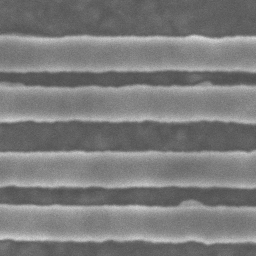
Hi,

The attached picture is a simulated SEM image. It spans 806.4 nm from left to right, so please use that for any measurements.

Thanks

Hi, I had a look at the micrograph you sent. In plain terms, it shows lines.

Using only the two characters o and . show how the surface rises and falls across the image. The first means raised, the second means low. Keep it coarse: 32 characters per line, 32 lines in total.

................................
................................
................................
................................
oo........o.............o.......
oooooooooooooooooooooooooooooooo
oooooooooooooooooooooooooooooooo
oooooooooooooooooooooooooooooooo
oooooooooooooooooooooooooooooooo
................................
................................
oooooooooooooooooooooooooooooooo
oooooooooooooooooooooooooooooooo
oooooooooooooooooooooooooooooooo
oooooooooooooooooooooooooooooooo
................................
................................
................................
................................
oooooooooooooooooooooooooooooooo
oooooooooooooooooooooooooooooooo
oooooooooooooooooooooooooooooooo
oooooooooooooooooooooooooooooooo
.............o................oo
................................
.......................oo.......
oooooooooooooooooooooooooooooooo
oooooooooooooooooooooooooooooooo
oooooooooooooooooooooooooooooooo
oooooooooooooooooooooooooooooooo
................................
................................